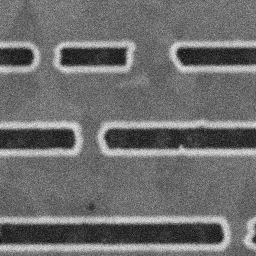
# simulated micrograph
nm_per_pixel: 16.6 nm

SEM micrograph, one or a few lines or trenches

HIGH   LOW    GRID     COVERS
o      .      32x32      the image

oooooooooooooooooooooooooooooooo
oooooooooooooooooooooooooooooooo
oooooooooooooooooooooooooooooooo
oooooooooooooooooooooooooooooooo
oooooooooooooooooooooooooooooooo
ooooooooooooooooooooooooooooo.oo
....ooo.........oooooo..........
....ooo.........oooooo..........
....oooo........ooooooo.........
oooooooooooooooooooooooooooooooo
oooooooooooooooooooooooooooooooo
oooooooooooooooooooooooooooooooo
oooooooooooooooooooooooooooooooo
oooooooooooooooooooooooooooooooo
oooooooooooooooooooooooooooooooo
ooooooooooooooooooooooooo.oooooo
..........ooo...................
..........ooo...................
..........ooo...................
oooooooooooooooooooooooooooooooo
oooooooooooooooooooooooooooooooo
oooooooooooooooooooooooooooooooo
oooooooooooooooooooooooooooooooo
oooooooooooooooooooooooooooooooo
oooooooooooooooooooooooooooooooo
oooooooooooooooooooooooooooooooo
oooooooooooooooooooooooooooooooo
..............o............ooooo
............................ooo.
............................ooo.
............................ooo.
oooooooooooooooooooooooooooooooo